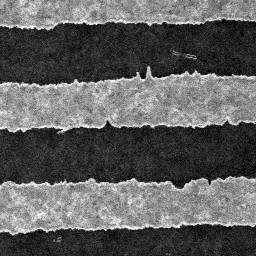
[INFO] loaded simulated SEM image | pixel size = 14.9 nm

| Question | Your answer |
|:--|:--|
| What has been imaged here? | one or a few lines or trenches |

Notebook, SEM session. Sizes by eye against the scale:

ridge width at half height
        45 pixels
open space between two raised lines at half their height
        835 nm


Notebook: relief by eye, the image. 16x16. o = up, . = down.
oooooooooooooooo
oooo............
................
................
................
oooooooooooooooo
oooooooooooooooo
oooooooooooooooo
................
................
................
o.o.ooooooo.oooo
oooooooooooooooo
oooooooooooooooo
oo..............
................